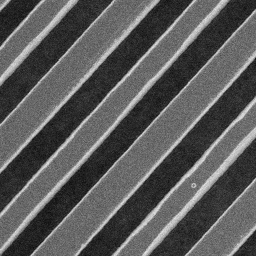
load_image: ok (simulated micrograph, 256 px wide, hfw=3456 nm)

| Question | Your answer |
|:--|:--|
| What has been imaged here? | lines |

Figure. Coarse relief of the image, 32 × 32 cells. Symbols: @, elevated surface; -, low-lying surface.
@----@@@@-----@@@@@-----@@@@----
----@@@@-----@@@@@@----@@@@-----
---@@@@-----@@@@@@----@@@@-----@
--@@@@-----@@@@@@----@@@@-----@@
-@@@@@----@@@@@@----@@@@-----@@@
@@@@@----@@@@@@----@@@@@----@@@@
@@@@----@@@@@@----@@@@@----@@@@@
@@@----@@@@@@----@@@@@----@@@@@@
@@----@@@@@@-----@@@@----@@@@@@-
@-----@@@@@-----@@@@----@@@@@@--
-----@@@@@-----@@@@----@@@@@@---
----@@@@@-----@@@@-----@@@@@----
---@@@@@-----@@@@-----@@@@@-----
--@@@@@@----@@@@-----@@@@@-----@
-@@@@@@----@@@@@----@@@@@-----@@
@@@@@@----@@@@@----@@@@@-----@@@
@@@@@----@@@@@----@@@@@@----@@@@
@@@@----@@@@@----@@@@@@----@@@@-
@@@----@@@@@----@@@@@@----@@@@--
@@-----@@@@----@@@@@@----@@@@@--
@-----@@@@----@@@@@@----@@@@@---
-----@@@@----@@@@@@-----@@@@----
----@@@@----@@@@@@-----@@@@-----
---@@@@-----@@@@@-----@@@@-----@
--@@@@@----@@@@@-----@@@@-----@@
-@@@@@----@@@@@-----@@@@-----@@@
@@@@@----@@@@@@----@@@@-----@@@@
@@@@----@@@@@@----@@@@-----@@@@@
@@@----@@@@@@----@@@@-----@@@@@@
@@----@@@@@@----@@@@@----@@@@@@-
@----@@@@@@----@@@@@----@@@@@@--
----@@@@@@----@@@@@-----@@@@@---